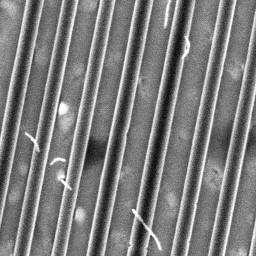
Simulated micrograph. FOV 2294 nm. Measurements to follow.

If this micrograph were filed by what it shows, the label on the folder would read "parallel lines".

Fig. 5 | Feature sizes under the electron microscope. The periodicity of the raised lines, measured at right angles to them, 341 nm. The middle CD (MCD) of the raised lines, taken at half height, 0.137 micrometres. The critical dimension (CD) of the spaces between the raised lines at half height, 0.201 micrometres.